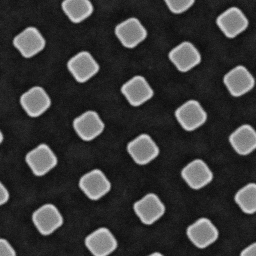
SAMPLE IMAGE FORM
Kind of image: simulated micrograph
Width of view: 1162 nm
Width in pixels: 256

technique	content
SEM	a regular array of raised bodies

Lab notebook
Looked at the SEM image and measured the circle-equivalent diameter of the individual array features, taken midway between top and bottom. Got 122 nanometres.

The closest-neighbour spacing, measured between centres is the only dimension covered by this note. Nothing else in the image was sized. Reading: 58.7 pixels